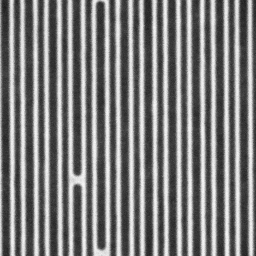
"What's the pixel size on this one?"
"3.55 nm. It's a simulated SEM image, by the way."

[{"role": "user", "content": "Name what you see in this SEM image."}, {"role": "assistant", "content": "parallel lines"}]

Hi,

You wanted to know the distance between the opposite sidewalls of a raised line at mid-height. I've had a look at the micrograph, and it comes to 9.3 nm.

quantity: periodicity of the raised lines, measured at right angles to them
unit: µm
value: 0.0424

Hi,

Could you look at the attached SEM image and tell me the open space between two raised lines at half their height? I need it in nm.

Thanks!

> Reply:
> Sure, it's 31.5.